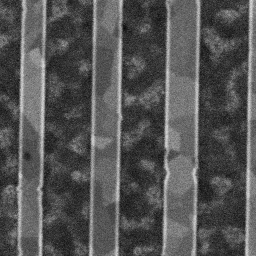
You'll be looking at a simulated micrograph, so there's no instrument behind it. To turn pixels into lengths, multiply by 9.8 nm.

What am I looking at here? one or a few lines or trenches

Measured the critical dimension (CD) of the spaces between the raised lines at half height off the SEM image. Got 0.491 um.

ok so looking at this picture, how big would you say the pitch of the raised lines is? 0.734 micrometres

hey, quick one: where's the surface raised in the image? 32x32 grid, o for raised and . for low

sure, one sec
...ooo......ooo......oooo......o
...ooo......ooo......oooo......o
...ooo......ooo......oooo......o
...oo.......ooo......oooo......o
...oo.......ooo......oooo......o
...oo.......ooo......oooo......o
...oo.......ooo......oooo......o
...oo.......ooo......oooo......o
...oo.......ooo......oooo......o
...oo.......ooo......oooo......o
...oo.......ooo......oooo......o
...oo.......ooo......oooo......o
...oo.......ooo......oooo......o
...oo.......ooo......oooo......o
...oo.......ooo......oooo......o
...oo.......ooo......oooo......o
...oo.......ooo......oooo......o
...oo.......ooo......oooo......o
...oo.......ooo......oooo......o
...oo.......ooo......oooo......o
...oo.......ooo......oooo......o
...oo.......ooo......ooo.......o
..ooo......oooo......ooo.......o
..ooo......oooo......ooo.......o
..ooo......oooo......ooo.......o
..ooo......oooo......ooo.......o
...oo......oooo......ooo.......o
...oo......oooo......ooo.......o
...oo......oooo......ooo.......o
..ooo......oooo......ooo.......o
..ooo......oooo.....oooo.......o
..ooo......oooo.....oooo.......o